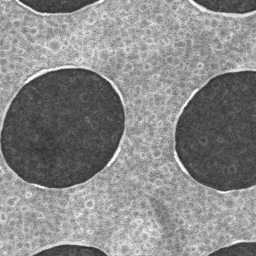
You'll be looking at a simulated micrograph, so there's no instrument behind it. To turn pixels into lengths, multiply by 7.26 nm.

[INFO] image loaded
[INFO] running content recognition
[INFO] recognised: holes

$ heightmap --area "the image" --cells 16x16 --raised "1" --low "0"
1100011111111000
1111111111111111
1111111111111111
1111111111111111
1110001111111100
1000000111111000
1000000011110000
0000000011100000
0000000011100000
0000000111100000
1000001111110000
1100011111111000
1111111111111111
1111111111111111
1111111111111111
1110001111111100